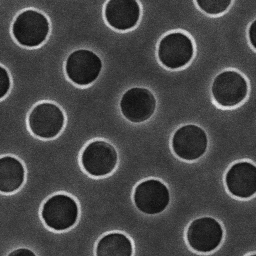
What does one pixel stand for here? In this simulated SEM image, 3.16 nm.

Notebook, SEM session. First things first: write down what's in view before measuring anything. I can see a regular array of holes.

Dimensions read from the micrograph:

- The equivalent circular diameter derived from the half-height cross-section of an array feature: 111 nm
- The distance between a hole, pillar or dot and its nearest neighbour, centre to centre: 65 px